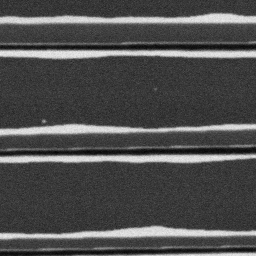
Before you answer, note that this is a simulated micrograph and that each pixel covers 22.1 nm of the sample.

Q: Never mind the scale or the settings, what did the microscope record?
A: lines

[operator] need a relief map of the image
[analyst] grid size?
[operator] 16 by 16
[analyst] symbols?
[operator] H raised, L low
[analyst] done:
LLLLLLLLLLLLLLLL
HHHHHHHHHHHHHHHH
HHHHHHHHHHHHHHHH
LLLLLLLLLLLLLLLL
LLLLLLLLLLLLLLLL
LLLLLLLLLLLLLLLL
LLLLLLLLLLLLLLLL
LLLLLLLLLLLLLLLL
HHHHHHHHHHHHHHHH
HHHHHHHHHHHHHHHH
LLLLLLLLLLLLLLLL
LLLLLLLLLLLLLLLL
LLLLLLLLLLLLLLLL
LLLLLLLLLLLLLLLL
LLLLLLLLLLLLLLLL
HHHHHHHHHHHHHHHH